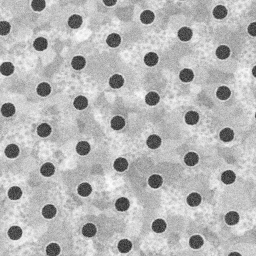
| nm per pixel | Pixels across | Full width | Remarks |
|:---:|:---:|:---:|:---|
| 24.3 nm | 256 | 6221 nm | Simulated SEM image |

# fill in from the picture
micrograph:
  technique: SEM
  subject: a regular array of holes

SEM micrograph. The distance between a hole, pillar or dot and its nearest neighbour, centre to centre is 39.8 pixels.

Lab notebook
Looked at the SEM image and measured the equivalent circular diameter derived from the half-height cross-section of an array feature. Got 0.378 microns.